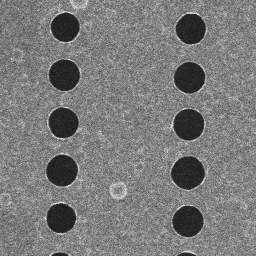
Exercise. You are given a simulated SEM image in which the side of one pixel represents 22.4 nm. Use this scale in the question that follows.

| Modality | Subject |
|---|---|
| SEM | a regular array of holes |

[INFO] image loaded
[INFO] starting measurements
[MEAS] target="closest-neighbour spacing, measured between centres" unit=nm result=1070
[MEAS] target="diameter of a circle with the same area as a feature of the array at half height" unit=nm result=702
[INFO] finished